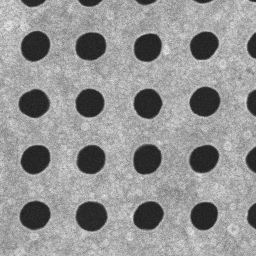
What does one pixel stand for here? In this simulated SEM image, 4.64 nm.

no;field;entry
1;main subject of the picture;a regular array of holes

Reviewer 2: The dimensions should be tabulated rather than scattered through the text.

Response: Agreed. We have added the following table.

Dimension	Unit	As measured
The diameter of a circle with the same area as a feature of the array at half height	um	0.134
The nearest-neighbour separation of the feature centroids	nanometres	259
